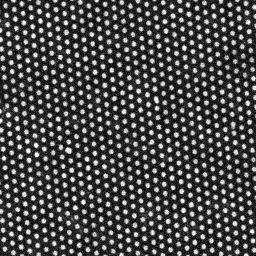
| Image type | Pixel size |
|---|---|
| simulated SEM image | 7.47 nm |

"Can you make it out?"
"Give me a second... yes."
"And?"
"a regular array of raised bodies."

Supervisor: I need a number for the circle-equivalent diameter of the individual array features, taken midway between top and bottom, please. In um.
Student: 0.0304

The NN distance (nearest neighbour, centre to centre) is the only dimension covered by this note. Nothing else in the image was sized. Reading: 9.2 px